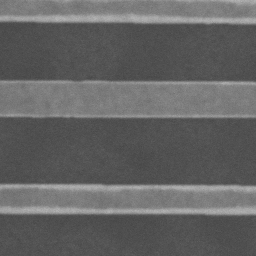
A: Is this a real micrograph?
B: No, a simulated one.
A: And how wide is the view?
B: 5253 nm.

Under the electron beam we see lines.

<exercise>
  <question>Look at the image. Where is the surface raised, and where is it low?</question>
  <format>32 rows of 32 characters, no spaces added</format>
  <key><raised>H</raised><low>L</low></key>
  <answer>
HHHHHHHHHHHHHHHHHHHHHHHHHHHHHHHH
HHHHHHHHHHHHHHHHHHHHHHHHHHHHHHHH
HHHHHHHHHHHHHHHHHHHHHHHHHHHHHHHH
LLLLLLLLLLLLLLLLLLLLLLLLLLLLLLLL
LLLLLLLLLLLLLLLLLLLLLLLLLLLLLLLL
LLLLLLLLLLLLLLLLLLLLLLLLLLLLLLLL
LLLLLLLLLLLLLLLLLLLLLLLLLLLLLLLL
LLLLLLLLLLLLLLLLLLLLLLLLLLLLLLLL
LLLLLLLLLLLLLLLLLLLLLLLLLLLLLLLL
LLLLLLLLLLLLLLLLLLLLLLLLLLLLLLLL
HHHHHHHHHHHHHHHHHHHHHHHHHHHHHHHH
HHHHHHHHHHHHHHHHHHHHHHHHHHHHHHHH
HHHHHHHHHHHHHHHHHHHHHHHHHHHHHHHH
HHHHHHHHHHHHHHHHHHHHHHHHHHHHHHHH
HHHHHHHHHHHHHHHHHHHHHHHHHHHHHHHH
LLLLLLLLLLLLLLLLLLLLLLLLLLLLLLLL
LLLLLLLLLLLLLLLLLLLLLLLLLLLLLLLL
LLLLLLLLLLLLLLLLLLLLLLLLLLLLLLLL
LLLLLLLLLLLLLLLLLLLLLLLLLLLLLLLL
LLLLLLLLLLLLLLLLLLLLLLLLLLLLLLLL
LLLLLLLLLLLLLLLLLLLLLLLLLLLLLLLL
LLLLLLLLLLLLLLLLLLLLLLLLLLLLLLLL
LLLLLLLLLLLLLLLLLLLLLLLLLLLLLLLL
HHHHHHHHHHHHHHHHHHHHHHHHHHHHHHHH
HHHHHHHHHHHHHHHHHHHHHHHHHHHHHHHH
HHHHHHHHHHHHHHHHHHHHHHHHHHHHHHHH
LHHHHHHHHHHHHHHHHHHHHHHHHHHHHHHH
LLLLLLLLLLLLLLLLLLLLLLLLLLLLLLLL
LLLLLLLLLLLLLLLLLLLLLLLLLLLLLLLL
LLLLLLLLLLLLLLLLLLLLLLLLLLLLLLLL
LLLLLLLLLLLLLLLLLLLLLLLLLLLLLLLL
LLLLLLLLLLLLLLLLLLLLLLLLLLLLLLLL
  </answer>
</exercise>